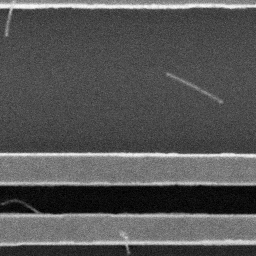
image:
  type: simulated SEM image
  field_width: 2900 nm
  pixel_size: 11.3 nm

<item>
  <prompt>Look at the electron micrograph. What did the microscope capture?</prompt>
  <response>lines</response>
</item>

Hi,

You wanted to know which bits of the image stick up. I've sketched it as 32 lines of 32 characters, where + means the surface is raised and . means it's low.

++++++++++++++++++++++++++++++++
................................
................................
................................
................................
................................
................................
................................
................................
................................
................................
................................
................................
................................
................................
................................
................................
................................
................................
++++++++++++++++++++++++++++++++
++++++++++++++++++++++++++++++++
++++++++++++++++++++++++++++++++
++++++++++++++++++++++++++++++++
................................
................................
................................
................................
++++++++++++++++++++++++++++++++
++++++++++++++++++++++++++++++++
++++++++++++++++++++++++++++++++
++++++.........+................
................................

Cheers